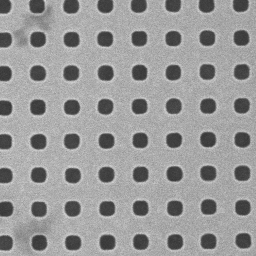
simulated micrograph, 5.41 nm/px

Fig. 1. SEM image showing a regular array of holes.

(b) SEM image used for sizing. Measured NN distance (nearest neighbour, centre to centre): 181 nanometres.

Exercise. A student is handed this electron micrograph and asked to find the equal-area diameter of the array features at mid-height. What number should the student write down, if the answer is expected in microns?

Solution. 0.088